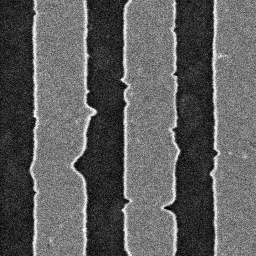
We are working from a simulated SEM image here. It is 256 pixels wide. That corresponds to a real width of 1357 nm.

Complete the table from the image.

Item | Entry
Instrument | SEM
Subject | one or a few lines or trenches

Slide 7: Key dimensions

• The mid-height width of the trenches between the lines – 0.211 micrometres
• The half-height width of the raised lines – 0.263 micrometres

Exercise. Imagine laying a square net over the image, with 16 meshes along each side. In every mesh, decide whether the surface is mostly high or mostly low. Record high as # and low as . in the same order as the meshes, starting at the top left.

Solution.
..###...###..###
..###...###..###
..###...###..###
..###...###..###
..###...###..###
..###...###..###
..####..###..###
..####..###..###
..###...###..###
..###...###...##
..###...###..###
..###...###..###
..###...###..###
..###...###..###
..###...###..###
..###...###..###